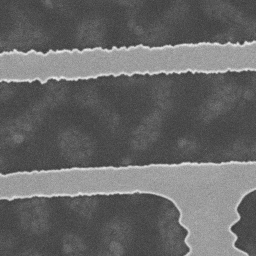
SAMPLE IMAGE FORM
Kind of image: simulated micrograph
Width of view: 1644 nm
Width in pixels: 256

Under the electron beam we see one or a few lines or trenches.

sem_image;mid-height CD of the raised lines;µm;0.173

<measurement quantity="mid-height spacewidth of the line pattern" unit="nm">588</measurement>